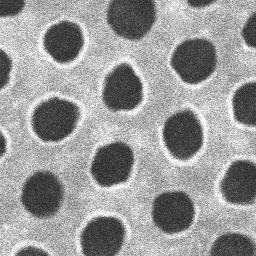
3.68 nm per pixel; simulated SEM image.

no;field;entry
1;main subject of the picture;a regular array of holes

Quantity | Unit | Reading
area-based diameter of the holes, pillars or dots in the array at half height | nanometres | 159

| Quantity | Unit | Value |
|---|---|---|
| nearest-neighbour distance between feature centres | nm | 277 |